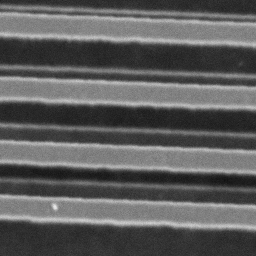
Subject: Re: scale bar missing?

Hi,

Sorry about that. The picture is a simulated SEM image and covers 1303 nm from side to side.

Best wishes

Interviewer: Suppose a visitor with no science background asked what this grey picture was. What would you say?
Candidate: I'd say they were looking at lines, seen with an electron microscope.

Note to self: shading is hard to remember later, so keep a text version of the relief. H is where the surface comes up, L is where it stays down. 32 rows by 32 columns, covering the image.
LLLLLLLLLLLLLLLLLLLLLLLLLLLLLLLL
HHHHHHHHHHHHHLLLLLLLLLLLLLLLLLLL
HHHHHHHHHHHHHHHHHHHHHHHHHHHHHHHH
HHHHHHHHHHHHHHHHHHHHHHHHHHHHHHHH
LLHHHHHHHHHHHHHHHHHHHHHHHHHHHHHH
LLLLLLLLLLLLLLLLLLLLLLLLLLLLLHHH
LLLLLLLLLLLLLLLLLLLLLLLLLLLLLLLL
LLLLLLLLLLLLLLLLLLLLLLLLLLLLLLLL
HLLLLLLLLLLLLLLLLLLLLLLLLLLLLLLL
HHHHHHHHHHHHHHHHHHHHHHHHHHHHHHLL
HHHHHHHHHHHHHHHHHHHHHHHHHHHHHHHH
HHHHHHHHHHHHHHHHHHHHHHHHHHHHHHHH
LLLLLHHHHHHHHHHHHHHHHHHHHHHHHHHH
LLLLLLLLLLLLLLLLLLLLLLLLLLLLHHHH
LLLLLLLLLLLLLLLLLLLLLLLLLLLLLLLL
LLLLLLLLLLLLLLLLLLLLLLLLLLLLLLLL
HHHHHHHHHHHHHHHHHHHHHHLLLLLLLLLL
HHHHHHHHHHHHHHHHHHHHHHHHHHHHHHHH
HHHHHHHHHHHHHHHHHHHHHHHHHHHHHHHH
HHHHHHHHHHHHHHHHHHHHHHHHHHHHHHHH
LLLLHHHHHHHHHHHHHHHHHHHHHHHHHHHH
LLLLLLLLLLLLLLLLLLLLLLLLLLLLHHHH
LLLLLLLLLLLLLLLLLLLLLLLLLLLLLLLL
HHHHHHHHHHHHHHHHHHHHHHHHHHLLLLLL
HHHHHHHHHHHHHHHHHHHHHHHHHHHHHHHH
HHHHHHHHHHHHHHHHHHHHHHHHHHHHHHHH
HHHHHHHHHHHHHHHHHHHHHHHHHHHHHHHH
LLLLHHHHHHHHHHHHHHHHHHHHHHHHHHHH
LLLLLLLLLLLLLLLLLLLLLLLLLLLLLLLH
LLLLLLLLLLLLLLLLLLLLLLLLLLLLLLLL
LLLLLLLLLLLLLLLLLLLLLLLLLLLLLLLL
LLLLLLLLLLLLLLLLLLLLLLLLLLLLLLLL